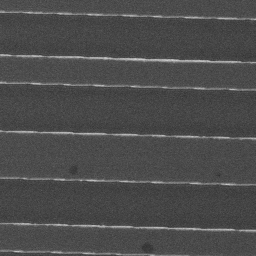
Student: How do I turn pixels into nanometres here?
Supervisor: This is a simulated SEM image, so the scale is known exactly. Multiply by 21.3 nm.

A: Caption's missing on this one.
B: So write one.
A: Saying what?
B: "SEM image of lines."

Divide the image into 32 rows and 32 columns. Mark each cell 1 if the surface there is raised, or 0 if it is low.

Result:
11111111111111111111111111111111
00011111111111111111111111111111
00000000000000000000000000000000
00000000000000000000000000000000
00000000000000000000000000000000
00000000000000000000000000000000
00000000000000000000000000000000
11111111111111111111110000000000
11111111111111111111111111111111
11111111111111111111111111111111
00000000111111111111111111111111
00000000000000000000000000000000
00000000000000000000000000000000
00000000000000000000000000000000
00000000000000000000000000000000
00000000000000000000000000000000
11111000000000000000000000000000
11111111111111111111111111111111
11111111111111111111111111111111
11111111111111111111111111111111
11111111111111111111111111111111
11111111111111111111111111111111
00000000001111111111111111111111
00000000000000000000000000000000
00000000000000000000000000000000
00000000000000000000000000000000
00000000000000000000000000000000
00000000000000000000000000000000
11111111111111111111100000000000
11111111111111111111111111111111
11111111111111111111111111111111
00000011111111111111111111111111